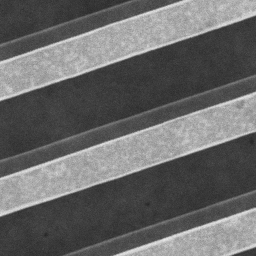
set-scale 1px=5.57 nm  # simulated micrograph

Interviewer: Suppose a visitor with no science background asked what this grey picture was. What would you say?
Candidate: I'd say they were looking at lines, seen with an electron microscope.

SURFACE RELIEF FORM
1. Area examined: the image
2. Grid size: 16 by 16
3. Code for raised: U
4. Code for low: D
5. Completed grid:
DDDDDDDUUUUUUUUU
DDDDUUUUUUUUUUDD
DUUUUUUUUUUDDDDD
UUUUUUUUDDDDDDDD
UUUUUDDDDDDDDDDD
UUUDDDDDDDDDDDUU
DDDDDDDDDDUUUUUU
DDDDDDDDUUUUUUUU
DDDDDUUUUUUUUUUD
DDUUUUUUUUUUDDDD
UUUUUUUUUDDDDDDD
UUUUUUDDDDDDDDDD
UUUDDDDDDDDDDDUU
DDDDDDDDDDDUUUUU
DDDDDDDDUUUUUUUU
DDDDDUUUUUUUUUUU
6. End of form